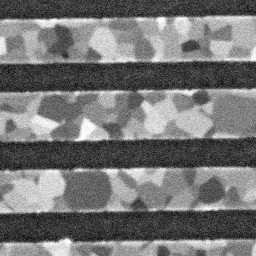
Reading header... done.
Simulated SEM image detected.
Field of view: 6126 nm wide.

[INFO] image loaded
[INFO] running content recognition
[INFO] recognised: lines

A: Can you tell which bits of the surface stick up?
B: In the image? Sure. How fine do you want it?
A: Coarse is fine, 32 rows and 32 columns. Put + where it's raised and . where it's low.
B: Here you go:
................................
................................
......++++++++++++++++++++++++++
++++++++++++++++++++++++++++++++
++++++++++++++++++++++++++++++++
++++++++++++++++++++++++++++++++
++++++++++++++++++++++++++++++++
++++++++++++++++++++++++........
................................
................................
................................
.................+++++++++++++++
++++++++++++++++++++++++++++++++
++++++++++++++++++++++++++++++++
++++++++++++++++++++++++++++++++
++++++++++++++++++++++++++++++++
++++++++++++++++++++++++++++++++
+++++.++........................
................................
................................
................................
++++++++++++++++++++++++++++++++
++++++++++++++++++++++++++++++++
++++++++++++++++++++++++++++++++
++++++++++++++++++++++++++++++++
++++++++++++++++++++++++++++++++
................................
................................
................................
................................
++++++++++++++++++++++++++++++++
++++++++++++++++++++++++++++++++